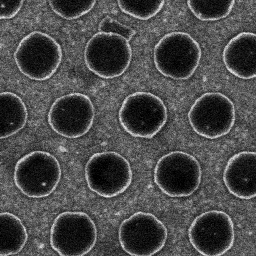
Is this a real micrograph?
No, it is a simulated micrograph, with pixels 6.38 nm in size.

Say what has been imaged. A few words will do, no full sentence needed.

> a regular array of raised bodies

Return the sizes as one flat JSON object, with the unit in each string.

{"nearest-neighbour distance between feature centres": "68.4 px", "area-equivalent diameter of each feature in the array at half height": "292 nm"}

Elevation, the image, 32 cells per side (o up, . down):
ooo...oooooo...ooooo....ooooo...
oo.....oooo.....oooo....ooooo...
.........................o......
................................
...ooo......ooo......ooo......oo
..ooooo....ooooo....ooooo....ooo
..oooooo...ooooo...oooooo...oooo
..oooooo...ooooo...oooooo...oooo
..ooooo....ooooo....oooo....oooo
...ooo.......oo......ooo......oo
................................
................................
ooo....oooo.....oooo.....oooo...
ooo...oooooo...oooooo...ooooo...
ooo...oooooo...oooooo...ooooo...
ooo...ooooo....ooooo....ooooo...
oo.....oooo.....oooo.....ooo....
................................
................................
...ooo......ooo......ooo.....ooo
..ooooo....ooooo....ooooo...oooo
..ooooo....ooooo...oooooo...oooo
..ooooo....ooooo...oooooo...oooo
..ooooo....ooooo....ooooo....ooo
....o........o.......oo.......oo
................................
..........................oo....
oo.....oooo.....oooo....ooooo...
ooo....ooooo...oooooo...ooooo...
ooo...oooooo...oooooo...ooooo...
ooo...oooooo...ooooo....ooooo...
oo.....oooo.....oooo.....ooo....